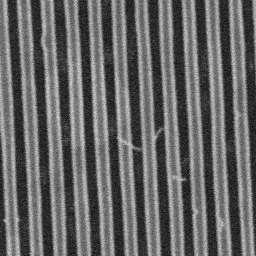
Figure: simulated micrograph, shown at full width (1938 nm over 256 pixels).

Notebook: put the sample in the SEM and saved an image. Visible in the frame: parallel lines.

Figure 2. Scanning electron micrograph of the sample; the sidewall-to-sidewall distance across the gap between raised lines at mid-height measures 102 nm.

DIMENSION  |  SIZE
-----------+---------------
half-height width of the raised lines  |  75.5 nm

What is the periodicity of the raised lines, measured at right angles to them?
177 nanometres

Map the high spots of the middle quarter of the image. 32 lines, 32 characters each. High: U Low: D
DDUUDDDUUDDDDUUDDDDUUDDDDUUDDDDU
DDUUDDDUUDDDDUUDDDDUUDDDDUUDDDDU
DDUUDDDUUDDDDUUDDDDUUDDDDUUDDDDU
DDUUDDDUUUDDDUUDDDDUUDDDDUUDDDDU
DDUUDDDUUUDDDUUDDDDUUDDDDUUDDDDU
DDUUDDDDUUDDDUUDDDDUUUDDDUUDDDDU
DDUUDDDDUUDDDUUUDDDUUUDDDUUDDDDU
DDUUDDDDUUDDDUUUDDDUUUDDDUUDDDDU
DDUUDDDDUUDDDUUUDDDUUUDDDUUDDDDU
DDUUDDDDUUDDDUUUDDDUUUDDDUUUDDDU
DDUUDDDDUUDDDUUUDDDDUUDDDUUUDDDU
DDUUDDDDUUDDDDUUDDDDUUDDDUUUDDDU
DDUUDDDDUUDDDDUUDDDDUUDDDUUUDDDU
DDUUDDDDUUDDDDUUDDDDUUDDDDUUDDDD
DDUUDDDDUUDDDDUUDDDDUUDDDDUUDDDD
DDUUDDDDUUDDDDUUDDDDUUDDDDUUDDDD
DDUUUDDDUUDDDDUUDDDDUUDDDDUUDDDD
DDUUUDDDUUDDDDUUDDDDUUDDDDUUDDDD
DDUUDDDDUUDDDDUUDDDDUUDDDDUUDDDD
DDUUDDDDUUUDDDUUDDDDUUUDDDUUDDDD
DDUUUDDDUUUDDDUUUDDDUUDDDDUUDDDD
DDUUUDDDUUUDDDUUUDDDUUDDDDUUDDDD
DDUUUDDDUUUDDDUUUDDDUUDDDDUUDDDD
DDUUUDDDUUUDDDUUUDDDUUDDDDUUDDDD
DDUUUDDDDUUDDDUUUDDDUUUDDDUUDDDD
DDDUUDDDDUUDDDUUUDDDUUUDDDUUDDDD
DDDUUDDDDUUDDDUUUDDDUUUDDDUUUDDD
DDDUUDDDDUUDDDDUUDDDUUUDDDUUUDDD
DDDUUDDDDUUDDDDUUDDDUUUDDDUUUDDD
DDDUUDDDDUUDDDDUUDDDUUUDDDUUUDDD
DDDUUDDDDUUDDDDUUDDDDUUDDDDUUDDD
DDDUUDDDDUUDDDDUUDDDDUUDDDDUUDDD